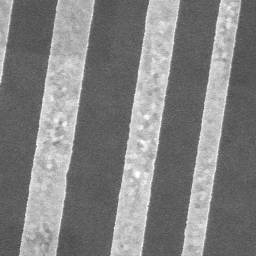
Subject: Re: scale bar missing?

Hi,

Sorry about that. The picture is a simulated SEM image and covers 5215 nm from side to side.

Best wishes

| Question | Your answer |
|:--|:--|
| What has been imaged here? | one or a few lines or trenches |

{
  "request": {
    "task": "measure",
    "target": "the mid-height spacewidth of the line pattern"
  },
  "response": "44.6 pixels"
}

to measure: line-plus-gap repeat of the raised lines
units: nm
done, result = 1560